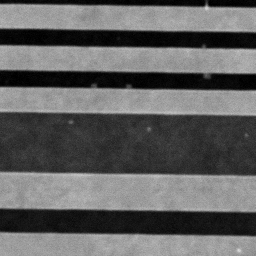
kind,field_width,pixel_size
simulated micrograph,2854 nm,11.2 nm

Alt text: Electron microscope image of groups of lines, slits or small figures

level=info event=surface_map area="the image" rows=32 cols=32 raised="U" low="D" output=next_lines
DDDDDDDDDDDDDDDDDDDDDDDDDDDDDDDD
UUUUUUUUUUUUUUUUUUUUUUUUUUUUUUUU
UUUUUUUUUUUUUUUUUUUUUUUUUUUUUUUU
DDDDDUUUUUUUUUUUUUUUUUUUUUUUUUUU
DDDDDDDDDDDDDDDDDDDDDDDDDDDDDDDD
DDDDDDDDDDDDDDDDDDDDDDDDDDDDDDDD
UUUUUUUUUUUUUUUUUUUUUUUUUUUUUUUU
UUUUUUUUUUUUUUUUUUUUUUUUUUUUUUUU
UUUUUUUUUUUUUUUUUUUUUUUUUUUUUUUU
DDDDDDDDDDDDDDDDDDDDDDDDDDDDDDDD
DDDDDDDDDDDDDDDDDDDDDDDDDDDDDDDD
UUUUUUUUUUUUUUUUUUUUUUUUUUUUUUUU
UUUUUUUUUUUUUUUUUUUUUUUUUUUUUUUU
UUUUUUUUUUUUUUUUUUUUUUUUUUUUUUUU
DDDDDDDDDDDDDDDDDDDDDDDDDDDDDDDD
DDDDDDDDDDDDDDDDDDDDDDDDDDDDDDDD
DDDDDDDDDDDDDDDDDDDDDDDDDDDDDDDD
DDDDDDDDDDDDDDDDDDDDDDDDDDDDDDDD
DDDDDDDDDDDDDDDDDDDDDDDDDDDDDDDD
DDDDDDDDDDDDDDDDDDDDDDDDDDDDDDDD
DDDDDDDDDDDDDDDDDDDDDDDDDDDDDDDD
DDDDDDDDDDDDDDDDDDDDDDDDDDDDDDDD
UUUUUUUUUUUUUUUUUUUUUUUUUUUUUUUU
UUUUUUUUUUUUUUUUUUUUUUUUUUUUUUUU
UUUUUUUUUUUUUUUUUUUUUUUUUUUUUUUU
UUUUUUUUUUUUUUUUUUUUUUUUUUUUUUUU
DDDDDDDDDDDDDDDDDDDDDDDDDDDDDDDD
DDDDDDDDDDDDDDDDDDDDDDDDDDDDDDDD
DDDDDDDDDDDDDDDDDDDDDDDDDDDDDDDD
UUUUUUUUUUUUUUUUUUUUUUUUUDDDDDDD
UUUUUUUUUUUUUUUUUUUUUUUUUUUUUUUU
UUUUUUUUUUUUUUUUUUUUUUUUUUUUUUUU